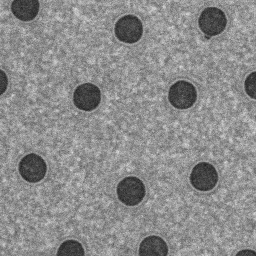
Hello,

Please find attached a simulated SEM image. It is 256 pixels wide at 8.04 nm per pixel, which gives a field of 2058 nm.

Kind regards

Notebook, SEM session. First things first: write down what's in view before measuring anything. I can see holes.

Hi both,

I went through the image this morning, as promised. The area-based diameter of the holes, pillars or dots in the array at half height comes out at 241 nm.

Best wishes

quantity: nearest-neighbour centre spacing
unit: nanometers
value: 634